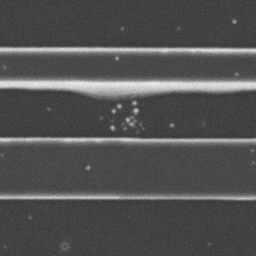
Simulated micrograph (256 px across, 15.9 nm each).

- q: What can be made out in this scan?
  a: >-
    lines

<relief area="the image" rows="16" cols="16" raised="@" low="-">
----------------
----------------
----------------
@@@@@@@@@@@@@@@@
@@@@@@@@@@@@@@@@
----------------
----------------
----------------
----------------
@@@@@@@@@@@@@@@@
@@@@@@@@@@@@@@@@
@@@@@@@@@@@@@@@@
----------------
----------------
----------------
----------------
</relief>